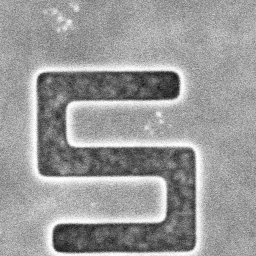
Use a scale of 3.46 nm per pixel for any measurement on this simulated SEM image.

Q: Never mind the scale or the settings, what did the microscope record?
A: groups of lines, slits or small figures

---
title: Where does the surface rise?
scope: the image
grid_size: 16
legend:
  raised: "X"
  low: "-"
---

XXXXXXXXXXXXXXXX
XXXXXXXXXXXXXXXX
XXXXXXXXXXXXXXXX
XXXXXXXXXXXXXXXX
XXX--------XXXXX
XX---------XXXXX
XX---XXXXXXXXXXX
XX--XXXXXXXXXXXX
XX--XXXXXXXXXXXX
XX----------XXXX
XX----------XXXX
XXXXXXXXXX--XXXX
XXXXXXXXXX--XXXX
XXXXXXXXXX--XXXX
XXX---------XXXX
XXX---------XXXX